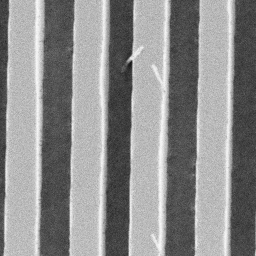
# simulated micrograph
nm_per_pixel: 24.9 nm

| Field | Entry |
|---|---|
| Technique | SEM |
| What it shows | lines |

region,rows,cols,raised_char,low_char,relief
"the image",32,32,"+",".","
.++++....++++....++++....++++...
.++++....++++....++++....++++...
.++++....++++....++++....++++...
.++++....++++....++++....++++...
.++++....++++....++++....++++...
.++++....++++....++++....++++...
.++++....++++....++++....++++...
.++++....++++...+++++....++++...
.++++....++++....++++....++++...
.++++....++++....++++....++++...
.++++....++++....++++....++++...
.++++....++++....++++....++++...
.++++....++++....++++....++++...
.++++....++++....++++....++++...
.++++....++++....++++....++++...
.++++....++++....++++....++++...
.++++....++++...+++++....++++...
.++++....++++...+++++....++++...
.++++....++++...+++++....++++...
.++++....++++...++++.....++++...
.++++....++++...++++.....++++...
.++++....++++...++++.....++++...
.++++....++++...++++.....++++...
.++++....++++...++++.....++++...
.++++....++++...++++....+++++...
.++++....++++...++++....+++++...
.++++....++++...++++....++++....
.++++....++++...++++....++++....
.++++....++++...++++....++++....
.++++....++++...++++....++++....
.++++....++++...++++....++++....
.++++....++++...++++....++++....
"